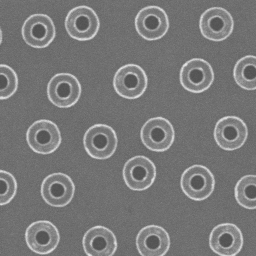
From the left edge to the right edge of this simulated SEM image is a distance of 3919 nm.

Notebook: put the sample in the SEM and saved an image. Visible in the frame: a regular array of ring-shaped raised bodies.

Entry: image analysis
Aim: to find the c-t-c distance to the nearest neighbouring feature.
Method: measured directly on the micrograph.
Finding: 779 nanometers